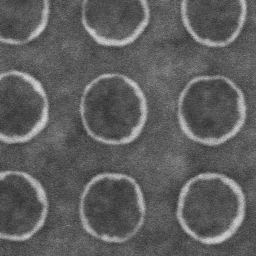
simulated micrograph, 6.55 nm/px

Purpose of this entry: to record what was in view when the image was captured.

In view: raised bodies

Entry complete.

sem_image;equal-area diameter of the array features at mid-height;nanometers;436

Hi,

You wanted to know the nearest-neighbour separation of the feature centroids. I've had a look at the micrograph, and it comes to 0.641 microns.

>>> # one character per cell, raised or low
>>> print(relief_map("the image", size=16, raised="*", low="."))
***..****..****.
***..****...***.
**....**....***.
................
................
**...****...***.
***..****..****.
***..****..****.
**....**....**..
................
................
**....**....***.
***..****..****.
***..****..****.
**....**....**..
................